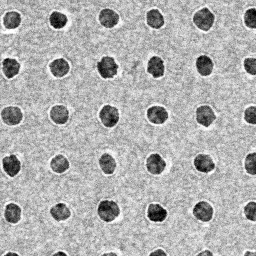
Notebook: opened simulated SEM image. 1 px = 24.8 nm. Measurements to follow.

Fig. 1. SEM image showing a regular array of holes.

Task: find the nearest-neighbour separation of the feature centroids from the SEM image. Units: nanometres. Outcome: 1160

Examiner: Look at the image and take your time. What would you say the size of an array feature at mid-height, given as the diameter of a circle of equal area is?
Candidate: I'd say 0.512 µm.